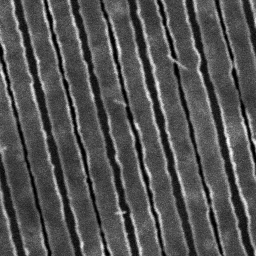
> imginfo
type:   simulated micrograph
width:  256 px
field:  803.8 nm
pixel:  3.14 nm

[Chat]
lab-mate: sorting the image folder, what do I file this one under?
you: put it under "parallel lines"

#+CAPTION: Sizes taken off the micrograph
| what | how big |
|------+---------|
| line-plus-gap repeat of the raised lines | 87.1 nanometers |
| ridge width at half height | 69.8 nanometers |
